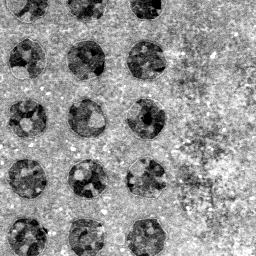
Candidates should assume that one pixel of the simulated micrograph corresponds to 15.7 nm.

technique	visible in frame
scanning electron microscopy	a regular array of raised bodies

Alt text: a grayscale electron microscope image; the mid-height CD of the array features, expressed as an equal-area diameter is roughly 623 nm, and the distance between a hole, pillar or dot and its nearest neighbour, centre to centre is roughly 922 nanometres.